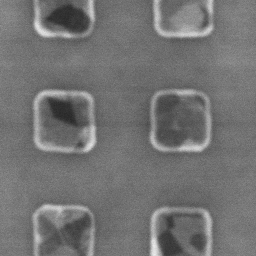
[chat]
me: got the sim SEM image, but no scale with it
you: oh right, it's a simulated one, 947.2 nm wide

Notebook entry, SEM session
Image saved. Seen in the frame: raised bodies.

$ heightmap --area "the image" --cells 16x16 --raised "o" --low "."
..oooo....ooo...
..oooo....ooo...
................
................
................
................
..oooo....ooo...
..oooo....ooo...
..oooo....ooo...
................
................
................
................
..oooo....ooo...
..oooo....ooo...
..oooo....ooo...